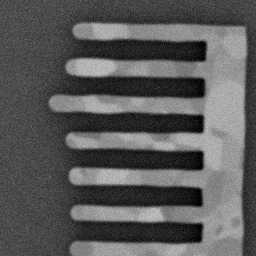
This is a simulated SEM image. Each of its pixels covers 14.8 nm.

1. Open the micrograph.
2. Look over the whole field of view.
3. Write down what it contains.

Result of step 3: groups of lines, slits or small figures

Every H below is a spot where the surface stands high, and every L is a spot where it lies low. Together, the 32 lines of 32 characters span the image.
LLLLLLLLLLLLLLLLLLLLLLLLLLLLLLLL
LLLLLLLLLLLLLLLLLLLLLLLLLLLLLLLL
LLLLLLLLLLLLLLLLLLLLLLLLLLLLLLLL
LLLLLLLLLHHHHHHHHHHHHHHHHHHHHHHL
LLLLLLLLLHHHHHHHHHHHHHHHHHHHHHHL
LLLLLLLLLLLLLLLLLLLLLLLLLLHHHHHL
LLLLLLLLLLLLLLLLLLLLLLLLLLHHHHHL
LLLLLLLLLHHHHHLLLLLLLLLLLLHHHHHL
LLLLLLLLHHHHHHHHHHHHHHHHHHHHHHHL
LLLLLLLLLLHHHHHHHHHHHHHHHHHHHHHL
LLLLLLLLLLLLLLLLLLLLLLLLLLHHHHHL
LLLLLLLLLLLLLLLLLLLLLLLLLLHHHHHL
LLLLLLHHHHHHHHHHHHHHHHHHHHHHHHLL
LLLLLLHHHHHHHHHHHHHHHHHHHHHHHHLL
LLLLLLLLLLLLLLLLLLLLLLLLLHHHHHHL
LLLLLLLLLLLLLLLLLLLLLLLLLLHHHHHL
LLLLLLLLLLLLLLLLLLLLLLLLLHHHHHHL
LLLLLLLLHHHHHHHHHHHHHHHHHHHHHHLL
LLLLLLLLLHHHHHHHHHHHHHHHHHHHHHLL
LLLLLLLLLLLLLLLLLLLLLLLLLHHHHHLL
LLLLLLLLLLLLLLLLLLLLLLLLLHHHHHLL
LLLLLLLLLHHHHHHHHHHHHHHHHHHHHHLL
LLLLLLLLLHHHHHHHHHHHHHHHHHHHHHLL
LLLLLLLLLLLLLLLLLLLLLLLLLHHHHHLL
LLLLLLLLLLLLLLLLLLLLLLLLLHHHHHLL
LLLLLLLLLLLLLLLLLLLLLLLLLHHHHHLL
LLLLLLLLLHHHHHHHHHHHHHHHHHHHHHLL
LLLLLLLLLLHHHHHHHHHHHHHHHHHHHHLL
LLLLLLLLLLLLLLLLLLLLLLLLLHHHHHLL
LLLLLLLLLLLLLLLLLLLLLLLLLHHHHHLL
LLLLLLLLLHHHHHHHHHHHHLHHHHHHHHLL
LLLLLLLLLHHHHHHHHHHHHHHHHHHHHHLL